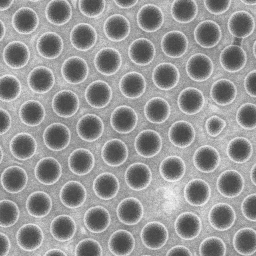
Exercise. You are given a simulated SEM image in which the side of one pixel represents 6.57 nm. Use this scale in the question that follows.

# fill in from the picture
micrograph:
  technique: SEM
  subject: a regular array of raised bodies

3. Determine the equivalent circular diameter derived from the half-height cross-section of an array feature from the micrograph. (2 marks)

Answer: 177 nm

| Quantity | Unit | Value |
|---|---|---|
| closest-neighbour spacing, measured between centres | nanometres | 224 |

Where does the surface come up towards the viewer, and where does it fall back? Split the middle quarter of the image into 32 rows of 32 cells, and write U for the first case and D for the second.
UUUUUUDDUUUUUUDDDDDDDDDUUUUUDDDU
UUUUUUDDUUUUUUDDDDDDDDDUUUUUDDDU
UUUUUUDDDDUUDDDDUUUDDDUUUUUUUDDU
UUUUUDDDDDDDDDUUUUUUDDUUUUUUUDDD
DUUUDDDDUUDDDDUUUUUUDDDUUUUUDDDD
DDDDDDUUUUUDDDUUUUUUDDDUUUUUDDDD
DDDDDDUUUUUUDDUUUUUUDDDDDDDDDDUU
UUUDDUUUUUUUDDDUUUUUDDDDDDDDDUUU
UUUDDUUUUUUUDDDDDDDDDDUUDDDDDUUU
UUUUDDUUUUUDDDDDDDDDDUUUUUDDDUUU
UUUUDDDUUUDDDDDDDDDDUUUUUUDDDUUU
UUUDDDDDDDDDDUUUUDDDUUUUUUDDDUUU
UUUDDDDDDDDDUUUUUUDDUUUUUUDDDDDU
DDDDUUUUUDDDUUUUUUDDDUUUUUDDDDDD
DDDDUUUUUDDDUUUUUUDDDDUUUDDDUUUD
DDDUUUUUUUDDUUUUUUDDDDDDDDDUUUUU
UDDUUUUUUUDDDUUUUDDDDDDDDDUUUUUU
UDDDUUUUUDDDDDDDDDDUUUUUDDUUUUUU
UDDDUUUUUDDDDDDDDDUUUUUUDDUUUUUU
UDDDDDDDDDDUUUUDDDUUUUUUDDDUUUUU
UDDDDDDDDDUUUUUDDDUUUUUUDDDDUUUD
DDDUUUDDDDUUUUUUDDUUUUUUDDDDDDDD
DDUUUUUDDDUUUUUUDDDUUUUDDDDDDDDD
DUUUUUUDDDUUUUUDDDDDDDDDDDUUUDDD
DUUUUUUDDDUUUUUDDDDDDDDDUUUUUUDD
DUUUUUUDDDDDDDDDDUUUUDDDUUUUUUDD
DDUUUUUDDDDDDDDDUUUUUDDDUUUUUUDD
DDDUUDDDDUUUDDDUUUUUUUDDUUUUUUDD
DDDDDDDDUUUUUDDUUUUUUUDDDUUUUDDD
DUUDDDDUUUUUUUDDUUUUUUDDDDDDDDDU
UUUUUDDUUUUUUUDDUUUUUDDDDDDDDDDU
UUUUUDDDUUUUUDDDDDDDDDDDDDDDDDUU